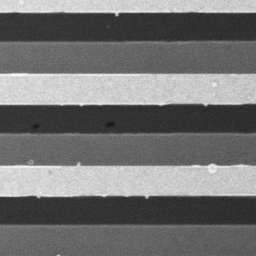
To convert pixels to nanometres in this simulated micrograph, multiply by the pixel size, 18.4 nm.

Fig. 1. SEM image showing lines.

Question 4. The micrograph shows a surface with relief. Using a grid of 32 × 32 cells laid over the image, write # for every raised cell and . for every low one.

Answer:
################################
..............#.................
................................
................................
................................
################################
################################
################################
################################
################################
################################
################################
################################
................................
................................
................................
................................
################################
################################
################################
################################
################################
################################
################################
....#........#....#.............
................................
................................
................................
################################
################################
################################
################################